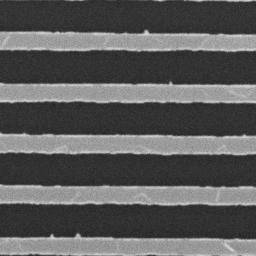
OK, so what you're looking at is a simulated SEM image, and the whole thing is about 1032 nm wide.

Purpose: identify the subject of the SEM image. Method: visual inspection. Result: lines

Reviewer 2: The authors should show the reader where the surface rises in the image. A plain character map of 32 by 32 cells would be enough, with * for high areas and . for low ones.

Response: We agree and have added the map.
................................
................................
................................
................................
********************************
********************************
................................
................................
................................
................................
*...............................
********************************
********************************
................................
................................
................................
................................
********************************
********************************
................................
................................
................................
................................
********************************
********************************
..................*.****..******
................................
................................
................................
................................
********************************
********************************